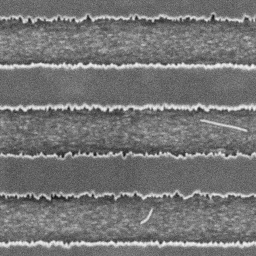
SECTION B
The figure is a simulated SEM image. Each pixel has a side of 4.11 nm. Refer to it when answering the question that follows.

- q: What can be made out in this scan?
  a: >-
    lines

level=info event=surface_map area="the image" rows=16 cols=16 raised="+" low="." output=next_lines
++++++++++++++++
................
................
................
++++++++++++++++
++++++++++++++++
++++++++++++++++
................
................
................
++++++++++++++++
++++++++++++++++
................
................
................
++++++++++++++++